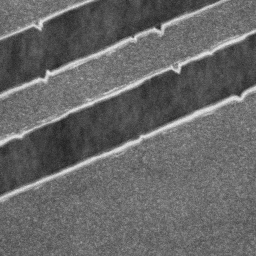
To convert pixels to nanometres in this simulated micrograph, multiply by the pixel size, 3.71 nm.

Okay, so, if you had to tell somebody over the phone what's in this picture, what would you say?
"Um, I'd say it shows one or a few lines or trenches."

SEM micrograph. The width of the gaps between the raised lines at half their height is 192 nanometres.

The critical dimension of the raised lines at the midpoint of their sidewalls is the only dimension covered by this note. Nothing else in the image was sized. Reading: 160 nanometers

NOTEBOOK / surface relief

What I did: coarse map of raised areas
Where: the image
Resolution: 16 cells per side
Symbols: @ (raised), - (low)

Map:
@@@@---------@@@
@@---------@@@@@
--------@@@@@@@-
------@@@@@@@---
---@@@@@@@------
-@@@@@@@--------
@@@@@@--------@@
@@@--------@@@@@
@--------@@@@@@@
-------@@@@@@@@@
-----@@@@@@@@@@@
--@@@@@@@@@@@@@@
@@@@@@@@@@@@@@@@
@@@@@@@@@@@@@@@@
@@@@@@@@@@@@@@@@
@@@@@@@@@@@@@@@@